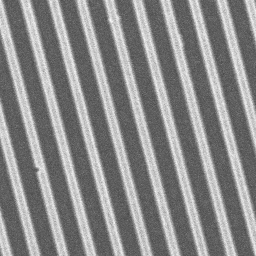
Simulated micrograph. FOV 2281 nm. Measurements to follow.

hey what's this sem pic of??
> parallel lines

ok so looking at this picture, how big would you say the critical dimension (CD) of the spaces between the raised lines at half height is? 162 nanometres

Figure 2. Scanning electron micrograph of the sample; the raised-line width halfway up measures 80.9 nm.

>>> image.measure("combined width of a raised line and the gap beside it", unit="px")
27.2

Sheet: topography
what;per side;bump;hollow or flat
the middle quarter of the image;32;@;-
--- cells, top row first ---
@@@----@@@----@@@----@@@----@@@-
-@@-----@@-----@@-----@@-----@@-
-@@-----@@-----@@-----@@-----@@-
-@@-----@@-----@@@----@@@----@@@
-@@@----@@@----@@@-----@@-----@@
--@@-----@@-----@@-----@@-----@@
--@@-----@@-----@@-----@@-----@@
--@@@----@@@----@@@----@@@----@@
--@@@----@@@-----@@-----@@-----@
---@@-----@@-----@@-----@@-----@
---@@-----@@-----@@-----@@-----@
---@@@----@@@----@@@----@@@----@
---@@@-----@@-----@@-----@@-----
----@@-----@@-----@@-----@@-----
----@@@----@@-----@@-----@@-----
----@@@----@@@----@@@----@@@----
-----@@-----@@-----@@-----@@----
-----@@-----@@-----@@-----@@----
@----@@-----@@-----@@-----@@----
@----@@@----@@@----@@@----@@@---
@-----@@-----@@-----@@-----@@---
@-----@@-----@@-----@@-----@@---
@@----@@-----@@-----@@-----@@---
@@----@@@----@@@----@@@----@@@--
@@-----@@-----@@-----@@-----@@--
@@-----@@-----@@-----@@-----@@--
@@-----@@@----@@-----@@-----@@@-
@@@----@@@----@@@----@@@----@@@-
-@@-----@@-----@@-----@@-----@@-
-@@-----@@-----@@-----@@-----@@-
-@@-----@@@----@@-----@@@----@@@
-@@@----@@@----@@@----@@@-----@@